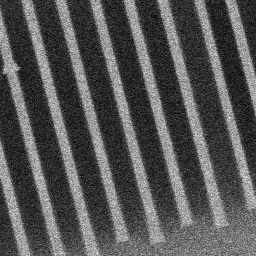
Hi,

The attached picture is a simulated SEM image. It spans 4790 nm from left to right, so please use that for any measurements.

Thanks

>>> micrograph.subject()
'parallel lines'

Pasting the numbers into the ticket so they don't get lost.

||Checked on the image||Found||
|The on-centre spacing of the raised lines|33.1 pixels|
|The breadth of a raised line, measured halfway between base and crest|0.22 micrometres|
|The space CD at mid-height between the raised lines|0.405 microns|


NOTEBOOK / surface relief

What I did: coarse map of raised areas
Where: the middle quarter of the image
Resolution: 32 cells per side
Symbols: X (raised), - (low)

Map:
--XXX------XXX-----XXX------XXX-
--XXX------XXX-----XXX------XXX-
--XXX------XXX-----XXX------XXX-
---XXX-----XXX------XXX-----XXX-
---XXX------XXX-----XXX------XXX
---XXX------XXX-----XXX------XXX
----XXX-----XXX------XXX-----XXX
----XXX-----XXX------XXX-----XXX
----XXX------XXX-----XXX------XX
----XXX------XXX-----XXX------XX
-----XXX-----XXX------XXX-----XX
-----XXX-----XXX------XXX-----XX
-----XXX------XXX-----XXX------X
-----XXX------XXX-----XXX------X
------XXX-----XXX------XXX-----X
------XXX------XX------XXX------
X-----XXX------XXX-----XXX------
X-----XXX------XXX-----XXX------
X------XXX-----XXX------XXX-----
X------XXX------XXX-----XXX-----
XX-----XXX------XXX-----XXX-----
XX-----XXX------XXX-----XXX-----
XX------XXX-----XXX------XXX----
XX------XXX------XXX-----XXX----
XXX-----XXX------XXX-----XXX----
XXX------XX------XXX------XX----
XXX------XXX-----XXX------XXX---
-XX------XXX------XXX-----XXX---
-XXX-----XXX------XXX-----XXX---
-XXX------XXX-----XXX------XXX--
-XXX------XXX-----XXX------XXX--
--XX------XXX------XXX-----XXX--